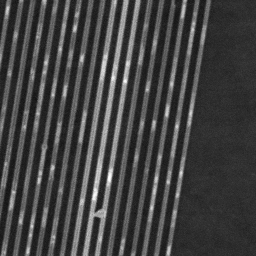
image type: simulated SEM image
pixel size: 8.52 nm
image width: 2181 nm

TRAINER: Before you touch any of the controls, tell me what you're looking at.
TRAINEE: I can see parallel lines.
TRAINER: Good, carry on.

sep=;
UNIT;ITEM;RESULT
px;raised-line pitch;11.6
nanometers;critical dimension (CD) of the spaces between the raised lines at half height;71.5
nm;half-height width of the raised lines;31.6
